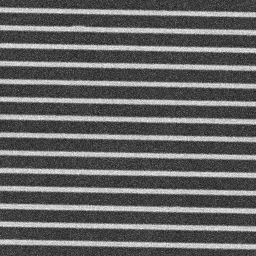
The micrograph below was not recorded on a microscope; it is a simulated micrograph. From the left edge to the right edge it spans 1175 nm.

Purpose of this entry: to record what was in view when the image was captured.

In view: parallel lines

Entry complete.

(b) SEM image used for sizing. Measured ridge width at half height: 0.0178 um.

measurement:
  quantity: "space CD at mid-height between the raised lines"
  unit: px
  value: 13.6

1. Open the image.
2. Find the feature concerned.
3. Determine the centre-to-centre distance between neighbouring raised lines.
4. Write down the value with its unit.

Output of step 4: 0.0821 micrometres